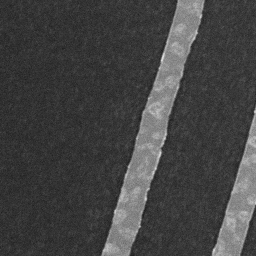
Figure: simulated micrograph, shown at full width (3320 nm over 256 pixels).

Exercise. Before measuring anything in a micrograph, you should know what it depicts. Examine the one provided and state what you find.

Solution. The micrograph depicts one or a few lines or trenches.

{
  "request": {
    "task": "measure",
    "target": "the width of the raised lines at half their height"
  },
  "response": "320 nanometers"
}